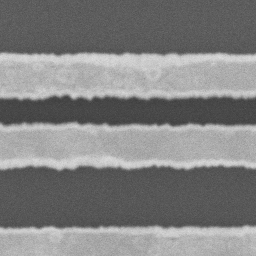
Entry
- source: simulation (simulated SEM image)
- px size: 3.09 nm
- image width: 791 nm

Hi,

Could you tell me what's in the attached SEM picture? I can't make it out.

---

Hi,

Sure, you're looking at lines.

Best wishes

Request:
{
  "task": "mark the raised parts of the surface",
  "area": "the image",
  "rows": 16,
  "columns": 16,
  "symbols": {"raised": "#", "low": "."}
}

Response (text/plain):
................
................
................
###.##......####
################
################
................
................
################
################
................
................
................
................
################
################